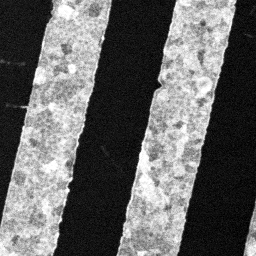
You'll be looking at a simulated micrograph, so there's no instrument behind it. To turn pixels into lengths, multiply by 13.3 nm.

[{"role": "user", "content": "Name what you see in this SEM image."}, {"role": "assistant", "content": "one or a few lines or trenches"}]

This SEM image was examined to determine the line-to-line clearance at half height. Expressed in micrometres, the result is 0.843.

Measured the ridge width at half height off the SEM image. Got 764 nm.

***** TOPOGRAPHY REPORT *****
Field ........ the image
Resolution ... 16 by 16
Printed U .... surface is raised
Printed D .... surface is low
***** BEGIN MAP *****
DDDUUUUDDDDUUUUD
DDDUUUUDDDDUUUDD
DDDUUUDDDDUUUUDD
DDDUUUDDDDUUUUDD
DDUUUUDDDDUUUUDD
DDUUUUDDDDUUUDDD
DDUUUDDDDDUUUDDD
DDUUUDDDDUUUUDDD
DUUUUDDDDUUUUDDD
DUUUUDDDDUUUUDDD
DUUUUDDDDUUUDDDD
DUUUDDDDUUUUDDDD
UUUUDDDDUUUUDDDD
UUUUDDDDUUUUDDDD
UUUUDDDDUUUDDDDD
UUUDDDDUUUUDDDDU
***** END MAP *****